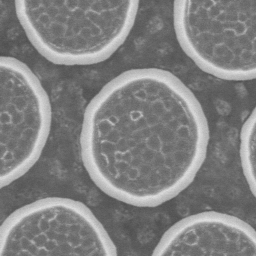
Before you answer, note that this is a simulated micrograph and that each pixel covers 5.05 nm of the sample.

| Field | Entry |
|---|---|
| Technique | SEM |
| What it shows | raised bodies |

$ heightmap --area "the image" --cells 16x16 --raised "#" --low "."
.#######...#####
..######...#####
..#####....#####
...###......####
##............##
##.....####.....
###...######....
###...#######...
###..########..#
##...########..#
#.....######...#
......#####.....
........##......
.#####..........
######.....#####
#######...######